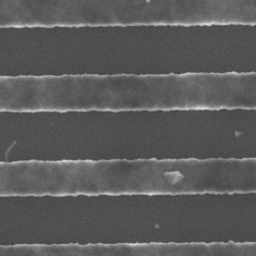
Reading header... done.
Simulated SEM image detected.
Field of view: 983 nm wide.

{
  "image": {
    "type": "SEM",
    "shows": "lines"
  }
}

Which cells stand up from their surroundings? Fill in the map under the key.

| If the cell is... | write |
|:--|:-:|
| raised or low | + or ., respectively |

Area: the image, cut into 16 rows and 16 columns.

++++++++++++++++
++++++++++++++++
................
................
................
++++++++++++++++
++++++++++++++++
................
................
................
++++++++++++++++
++++++++++++++++
................
................
................
++++++++++++++++